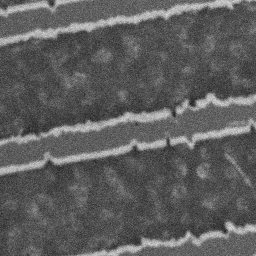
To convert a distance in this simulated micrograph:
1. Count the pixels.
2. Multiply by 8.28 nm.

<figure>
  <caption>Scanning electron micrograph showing one or a few lines or trenches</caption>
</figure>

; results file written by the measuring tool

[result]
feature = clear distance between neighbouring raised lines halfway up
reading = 0.814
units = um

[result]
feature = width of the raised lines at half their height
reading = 237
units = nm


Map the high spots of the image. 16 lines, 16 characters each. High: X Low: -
-XXXXXXXXXX-----
XXXXXX----------
X---------------
----------------
----------------
----------------
-------------XXX
-------XXXXXXXXX
--XXXXXXXXXXX---
XXXXXXX---------
X---------------
----------------
----------------
----------------
--------------XX
--------XXXXXXXX